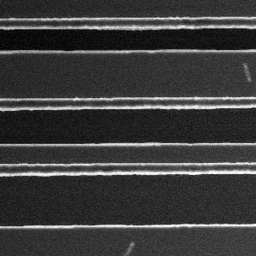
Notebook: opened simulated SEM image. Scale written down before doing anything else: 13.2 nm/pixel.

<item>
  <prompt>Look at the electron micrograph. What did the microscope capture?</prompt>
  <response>lines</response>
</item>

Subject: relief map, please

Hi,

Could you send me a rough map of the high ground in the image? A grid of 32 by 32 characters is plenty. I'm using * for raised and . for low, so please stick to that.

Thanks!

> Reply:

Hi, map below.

********************************
********************************
********************************
****..*.....*...................
................................
................................
.........**.********************
********************************
********************************
********************************
********************************
********************************
********************************
**********..*.*.................
................................
................................
................................
................................
********************************
********************************
********************************
********************************
................................
................................
................................
................................
................................
................................
********************************
********************************
********************************
********************************